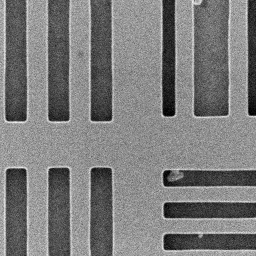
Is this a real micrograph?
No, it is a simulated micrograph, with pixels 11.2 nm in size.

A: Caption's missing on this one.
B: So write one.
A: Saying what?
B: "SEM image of groups of lines, slits or small figures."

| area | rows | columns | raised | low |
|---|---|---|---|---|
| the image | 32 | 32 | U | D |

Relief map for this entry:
UDDUUUDDDUUDDDUUUUUUDDUUDDDDDUUD
UDDUUUDDDUUDDDUUUUUUDDUUDDDDDUUD
UDDUUUDDDUUDDDUUUUUUDDUUDDDDDUUD
UDDUUUDDDUUDDDUUUUUUDDUUDDDDDUUD
UDDUUUDDDUUDDDUUUUUUDDUUDDDDDUUD
UDDUUUDDDUUDDDUUUUUUDDUUDDDDDUUD
UDDUUUDDDUUDDDUUUUUUDDUUDDDDDUUD
UDDUUUDDDUUDDDUUUUUUDDUUDDDDDUUD
UDDUUUDDDUUDDDUUUUUUDDUUDDDDDUUD
UDDUUUDDDUUDDDUUUUUUDDUUDDDDDUUD
UDDUUUDDDUUDDDUUUUUUDDUUDDDDDUUD
UDDUUUDDDUUDDDUUUUUUDDUUDDDDDUUD
UDDUUUDDDUUDDDUUUUUUDDUUDDDDDUUD
UDDUUUDDDUUDDDUUUUUUDDUUDDDDDUUD
UDDUUUDDDUUDDDUUUUUUUDUUUDDDUUUU
UUUUUUUUUUUUUUUUUUUUUUUUUUUUUUUU
UUUUUUUUUUUUUUUUUUUUUUUUUUUUUUUU
UUUUUUUUUUUUUUUUUUUUUUUUUUUUUUUU
UUUUUUUUUUUUUUUUUUUUUUUUUUUUUUUU
UUUUUUUUUUUUUUUUUUUUUUUUUUUUUUUU
UUUUUUUUUUUUUUUUUUUUUUUUUUUUUUUU
UDDUUUDDDUUDDDUUUUUUDDDDDDDDDDDD
UDDUUUDDDUUDDDUUUUUUDDDDDDDDDDDD
UDDUUUDDDUUDDDUUUUUUUUUUUUUUUUUU
UDDUUUDDDUUDDDUUUUUUUUUUUUUUUUUU
UDDUUUDDDUUDDDUUUUUUUDDDDDDDDDDD
UDDUUUDDDUUDDDUUUUUUDDDDDDDDDDDD
UDDUUUDDDUUDDDUUUUUUUUUUUUUUUUUU
UDDUUUDDDUUDDDUUUUUUUUUUUUUUUUUU
UDDUUUDDDUUDDDUUUUUUUDDDDDDDDDDD
UDDUUUDDDUUDDDUUUUUUDDDDDDDDDDDD
UDDUUUDDDUUDDDUUUUUUUUUUUUUUUUUU